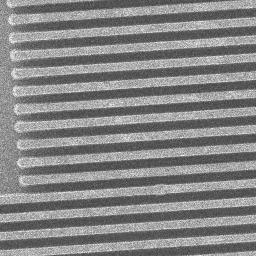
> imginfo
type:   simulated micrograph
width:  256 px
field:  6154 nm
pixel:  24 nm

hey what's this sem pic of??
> parallel lines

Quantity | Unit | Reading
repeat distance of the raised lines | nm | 431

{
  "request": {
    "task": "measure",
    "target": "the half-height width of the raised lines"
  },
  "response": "234 nm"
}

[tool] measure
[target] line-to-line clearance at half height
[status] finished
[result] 195 nanometers